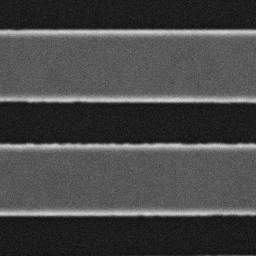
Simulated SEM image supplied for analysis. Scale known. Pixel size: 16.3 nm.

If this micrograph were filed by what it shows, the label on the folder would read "lines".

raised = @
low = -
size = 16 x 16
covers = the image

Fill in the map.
----------------
----------------
@@@@@@@@@@@@@@@@
@@@@@@@@@@@@@@@@
@@@@@@@@@@@@@@@@
@@@@@@@@@@@@@@@@
----------------
----------------
----------------
@@@@@@@@@@@@@@@@
@@@@@@@@@@@@@@@@
@@@@@@@@@@@@@@@@
@@@@@@@@@@@@@@@@
----------------
----------------
----------------